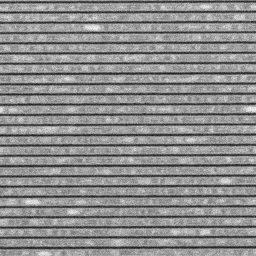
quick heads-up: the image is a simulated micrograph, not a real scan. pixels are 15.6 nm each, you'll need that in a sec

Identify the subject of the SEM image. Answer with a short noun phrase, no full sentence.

parallel lines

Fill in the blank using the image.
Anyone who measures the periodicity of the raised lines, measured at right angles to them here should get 160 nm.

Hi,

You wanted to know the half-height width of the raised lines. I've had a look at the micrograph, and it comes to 119 nm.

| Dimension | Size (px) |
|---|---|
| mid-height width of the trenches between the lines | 2.62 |